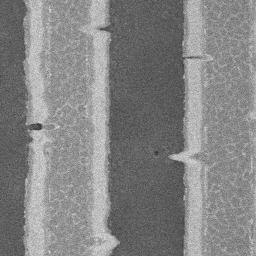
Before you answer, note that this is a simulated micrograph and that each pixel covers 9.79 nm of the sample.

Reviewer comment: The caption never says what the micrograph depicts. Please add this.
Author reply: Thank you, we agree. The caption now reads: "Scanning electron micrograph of one or a few lines or trenches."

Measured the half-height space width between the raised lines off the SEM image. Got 944 nanometres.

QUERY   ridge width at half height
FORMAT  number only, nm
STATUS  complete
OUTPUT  599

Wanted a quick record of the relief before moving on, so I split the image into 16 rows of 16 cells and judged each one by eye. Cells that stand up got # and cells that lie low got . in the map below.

..####......####
..####......####
..####......####
..####......####
..####......####
..####......####
..####......####
...###......####
...###......####
..####......####
..####......####
..####......####
..####......####
..####......####
..####......####
..####......####